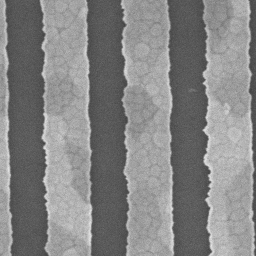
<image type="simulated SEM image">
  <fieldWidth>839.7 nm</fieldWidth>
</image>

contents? lines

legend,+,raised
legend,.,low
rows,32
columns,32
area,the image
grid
+....++++++....++++++.....+++++.
+....++++++....++++++.....+++++.
+....++++++.....+++++.....+++++.
+....++++++.....+++++.....+++++.
+.....+++++....++++++.....+++++.
+....++++++....++++++.....+++++.
+....++++++....++++++.....+++++.
+.....+++++.....+++++.....+++++.
+....++++++.....+++++.....+++++.
+....++++++.....+++++.....+++++.
+.....+++++.....+++++.....+++++.
+.....+++++.....+++++.....+++++.
+....++++++....++++++.....+++++.
+.....+++++.....+++++.....+++++.
+.....+++++.....+++++.....+++++.
+.....+++++.....+++++.....+++++.
+....++++++.....+++++.....+++++.
+....++++++.....+++++.....+++++.
+.....+++++.....+++++.....+++++.
+.....+++++.....+++++.....++++++
+.....+++++.....+++++.....++++++
+.....+++++.....+++++.....++++++
+....++++++.....+++++.....++++++
+.....+++++.....+++++.....++++++
+.....+++++.....+++++.....++++++
+.....+++++.....+++++.....+++++.
+.....+++++.....++++++....++++++
+.....+++++.....++++++....++++++
+.....+++++.....+++++.....++++++
++....+++++.....++++++....++++++
+.....+++++.....++++++....++++++
+.....+++++.....++++++....++++++